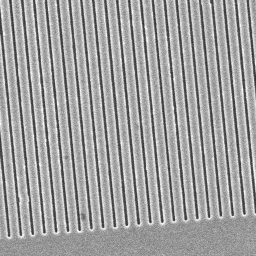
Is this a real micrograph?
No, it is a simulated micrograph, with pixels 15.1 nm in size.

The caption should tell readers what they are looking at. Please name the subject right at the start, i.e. parallel lines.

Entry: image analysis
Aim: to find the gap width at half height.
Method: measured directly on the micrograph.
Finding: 39.4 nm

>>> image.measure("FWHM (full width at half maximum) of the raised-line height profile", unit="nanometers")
130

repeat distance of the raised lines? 178 nm